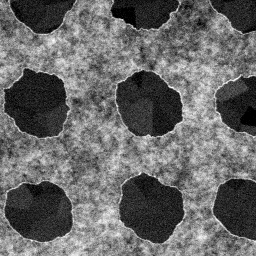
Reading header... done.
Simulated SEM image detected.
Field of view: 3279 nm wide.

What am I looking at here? raised bodies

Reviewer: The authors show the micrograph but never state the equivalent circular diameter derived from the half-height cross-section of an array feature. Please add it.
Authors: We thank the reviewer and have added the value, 854 nm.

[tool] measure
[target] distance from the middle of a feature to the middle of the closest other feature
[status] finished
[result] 1350 nm